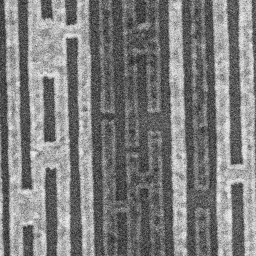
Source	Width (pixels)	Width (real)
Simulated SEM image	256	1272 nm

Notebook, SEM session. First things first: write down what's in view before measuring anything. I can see parallel lines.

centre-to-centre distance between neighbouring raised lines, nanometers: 116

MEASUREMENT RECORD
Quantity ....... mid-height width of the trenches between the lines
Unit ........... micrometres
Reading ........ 0.0634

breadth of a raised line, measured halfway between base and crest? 51 nanometres